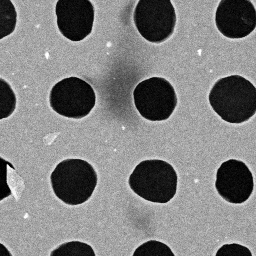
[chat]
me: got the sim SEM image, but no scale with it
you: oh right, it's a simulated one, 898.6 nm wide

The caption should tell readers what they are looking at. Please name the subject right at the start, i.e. holes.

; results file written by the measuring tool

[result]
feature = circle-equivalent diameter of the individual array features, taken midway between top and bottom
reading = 151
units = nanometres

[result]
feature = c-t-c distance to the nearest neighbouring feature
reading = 283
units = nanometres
